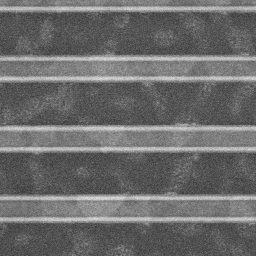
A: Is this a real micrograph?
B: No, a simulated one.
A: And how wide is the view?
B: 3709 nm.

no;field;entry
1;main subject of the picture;one or a few lines or trenches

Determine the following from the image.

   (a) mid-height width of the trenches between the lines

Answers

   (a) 724 nanometres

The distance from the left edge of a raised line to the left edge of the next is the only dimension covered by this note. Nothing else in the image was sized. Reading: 1010 nanometres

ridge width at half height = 293 nm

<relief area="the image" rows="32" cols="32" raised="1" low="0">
11111111111111111111111111111111
00000000000000000000000000000000
00000000000000000000000000000000
00000000000000000000000000000000
00000000000000000000000000000000
00000000000000000000000000000000
00000000000000000000000000000000
11111111111111111111111111111111
11111111111111111111111111111111
11111111111111111111111111111111
00000000000000000000000000000000
00000000000000000000000000000000
00000000000000000000000000000000
00000000000000000000000000000000
00000000000000000000000000000000
00000000000000000000000000000000
11111111111111111111111111111111
11111111111111111111111111111111
11111111111111111111111111111111
00000000000000000000000000000000
00000000000000000000000000000000
00000000000000000000000000000000
00000000000000000000000000000000
00000000000000000000000000000000
00000000000000000000000000000000
11111111111111111111111111111111
11111111111111111111111111111111
00000000000000000000000000000000
00000000000000000000000000000000
00000000000000000000000000000000
00000000000000000000000000000000
00000000000000000000000000000000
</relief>